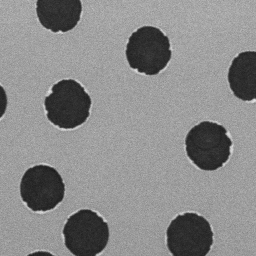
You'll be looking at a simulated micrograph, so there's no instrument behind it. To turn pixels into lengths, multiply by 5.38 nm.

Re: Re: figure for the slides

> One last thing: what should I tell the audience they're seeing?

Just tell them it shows holes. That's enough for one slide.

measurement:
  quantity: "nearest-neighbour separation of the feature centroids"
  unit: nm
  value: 496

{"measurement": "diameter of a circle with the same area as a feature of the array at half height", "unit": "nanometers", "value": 250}